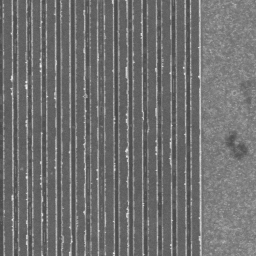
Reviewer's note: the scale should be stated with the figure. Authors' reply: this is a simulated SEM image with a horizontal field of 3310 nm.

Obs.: parallel lines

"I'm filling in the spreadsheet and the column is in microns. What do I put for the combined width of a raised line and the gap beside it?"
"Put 0.186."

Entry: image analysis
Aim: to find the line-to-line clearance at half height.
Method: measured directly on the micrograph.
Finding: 58.2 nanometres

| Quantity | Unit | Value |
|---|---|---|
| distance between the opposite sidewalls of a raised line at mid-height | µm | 0.128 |